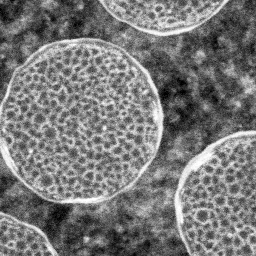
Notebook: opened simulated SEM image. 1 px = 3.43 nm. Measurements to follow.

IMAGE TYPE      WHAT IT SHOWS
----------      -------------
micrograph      raised bodies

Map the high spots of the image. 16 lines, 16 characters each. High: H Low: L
LLLLLLLHHHHHHHLL
LLLLLLLLHHHHHLLL
LLLLLHLLLLLLLLLL
LLHHHHHHLLLLLLLL
LHHHHHHHHLLLLLLL
LHHHHHHHHHLLLLLL
HHHHHHHHHHLLLLLL
HHHHHHHHHHLLLLLL
HHHHHHHHHHLLLLLH
HHHHHHHHHHLLLHHH
LHHHHHHHHLLLHHHH
LLHHHHHHLLLHHHHH
LLLHHHHLLLLHHHHH
HLLLLLLLLLLHHHHH
HHHLLLLLLLLHHHHH
HHHLLLLLLLLLHHHH